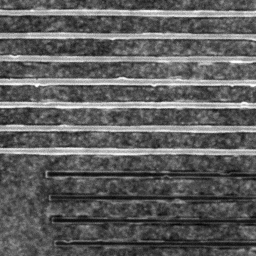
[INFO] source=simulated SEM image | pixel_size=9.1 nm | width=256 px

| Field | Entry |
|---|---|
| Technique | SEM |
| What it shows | parallel lines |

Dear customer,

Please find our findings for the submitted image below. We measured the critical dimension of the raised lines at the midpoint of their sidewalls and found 42.1 nanometers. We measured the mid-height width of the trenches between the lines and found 166 nanometres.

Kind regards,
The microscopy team